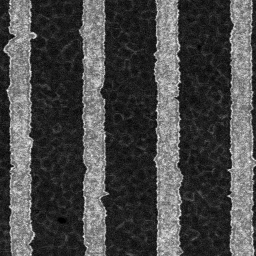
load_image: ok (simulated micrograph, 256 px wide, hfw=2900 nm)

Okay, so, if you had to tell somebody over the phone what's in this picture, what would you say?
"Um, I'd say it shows one or a few lines or trenches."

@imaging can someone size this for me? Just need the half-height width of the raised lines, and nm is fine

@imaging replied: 231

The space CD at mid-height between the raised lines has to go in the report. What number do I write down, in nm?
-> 602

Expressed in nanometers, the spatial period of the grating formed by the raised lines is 835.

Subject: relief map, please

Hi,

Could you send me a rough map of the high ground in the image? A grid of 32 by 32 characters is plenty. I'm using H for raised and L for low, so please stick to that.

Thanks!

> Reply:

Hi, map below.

LHHHLLLLLLHHHLLLLLLLHHLLLLLLLHHL
LHHHLLLLLLHHHLLLLLLLHHLLLLLLLHHH
LHHHLLLLLLHHHLLLLLLLHHLLLLLLLHHL
LHHHLLLLLLHHHLLLLLLLHHLLLLLLLHHL
LLHHLLLLLLHHHLLLLLLLHHLLLLLLLHHL
LHHHLLLLLLHHHLLLLLLLHHLLLLLLLHHL
LHHHLLLLLLHHHLLLLLLLHHLLLLLLLHHL
LHHHLLLLLLHHHLLLLLLHHHLLLLLLLHHL
LHHHLLLLLLLHHLLLLLLHHHLLLLLLLHHL
LHHHLLLLLLHHHLLLLLLHHHLLLLLLLHHL
LHHHLLLLLLLHHLLLLLLLHHLLLLLLLHHL
LHHHLLLLLLHHHLLLLLLLHHLLLLLLLHHL
LHHHLLLLLLHHHLLLLLLLHHLLLLLLLHHL
LHHHLLLLLLLHHLLLLLLLHHLLLLLLLHHL
LHHHLLLLLLHHHLLLLLLLHHLLLLLLLHHL
LHHHLLLLLLHHHLLLLLLLHHLLLLLLLHHL
LHHHLLLLLLLHHLLLLLLLHHLLLLLLLHHL
LHHHLLLLLLHHHLLLLLLLHHLLLLLLLHHH
LHHHLLLLLLLHHLLLLLLLHHLLLLLLLHHL
LHHHLLLLLLHHHLLLLLLLHHLLLLLLLHHH
LLHHLLLLLLLHHLLLLLLLHHLLLLLLLHHH
LHHHLLLLLLLHHLLLLLLLHHHLLLLLLHHH
LHHHLLLLLLHHHLLLLLLLHHHLLLLLLHHH
LHHHLLLLLLHHHLLLLLLLHHLLLLLLLHHH
LHHHLLLLLLHHHLLLLLLLHHLLLLLLLHHH
LHHHLLLLLLLHHLLLLLLLHHHLLLLLLHHH
LHHHLLLLLLLHHLLLLLLLHHLLLLLLLHHH
LHHHLLLLLLLHHLLLLLLLHHLLLLLLLHHH
LHHHLLLLLLLHHLLLLLLLHHLLLLLLLHHH
LHHHLLLLLLLHHLLLLLLLHHLLLLLLLHHH
LHHHLLLLLLLHHLLLLLLLHHLLLLLLLHHH
LHHHLLLLLLLHHLLLLLLLHHHLLLLLLHHH